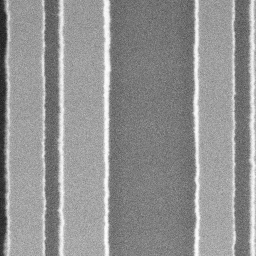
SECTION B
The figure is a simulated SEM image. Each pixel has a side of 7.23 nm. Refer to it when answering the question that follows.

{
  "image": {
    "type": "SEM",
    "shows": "lines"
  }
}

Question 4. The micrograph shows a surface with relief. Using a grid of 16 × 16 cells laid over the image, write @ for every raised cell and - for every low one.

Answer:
@@@@@@@-----@@@@
-@@@@@@-----@@@@
-@@@@@@-----@@@@
@@@@@@@-----@@@@
@@@@@@@-----@@@@
-@@@@@@-----@@@@
-@@@@@@-----@@@@
-@@@@@@-----@@@@
-@@@@@@-----@@@@
@@@@@@@-----@@@@
@@@@@@@-----@@@@
-@@@@@@-----@@@@
@@@@@@@-----@@@@
-@@@@@@-----@@@@
-@@@@@@-----@@@@
-@@@@@@-----@@@@